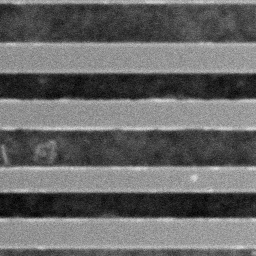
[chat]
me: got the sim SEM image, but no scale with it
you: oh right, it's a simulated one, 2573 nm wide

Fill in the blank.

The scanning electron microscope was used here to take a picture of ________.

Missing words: lines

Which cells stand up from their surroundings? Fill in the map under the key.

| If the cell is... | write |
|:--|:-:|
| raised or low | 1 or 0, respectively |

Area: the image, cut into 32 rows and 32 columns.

00000000000000000000000000000000
00000000000000000000000000000000
00000000000000000000000000000000
00000000000000000000000000000000
00000000000000000000000000000000
11111111111111111111111111111111
11111111111111111111111111111111
11111111111111111111111111111111
11111111111111111111111111111111
00000000000000000000000000000000
00000000000000000000000000000000
00000000000000000000000000000000
11101001100000111111110010111011
11111111111111111111111111111111
11111111111111111111111111111111
11111111111111111111111111111111
00000000000000000000000000000000
00000000000000000000000000000000
00000000000000000000000000000000
00000000000000000000000000000000
00000000000000000000000000000000
11111111111111111111111111111111
11111111111111111111111111111111
11111111111111111111111111111111
00000000000000000000000000000000
00000000000000000000000000000000
00000000000000000000000000000000
11111111111111111111111111111111
11111111111111111111111111111111
11111111111111111111111111111111
11111111111111111111111111111111
00000000000000000000000000000000